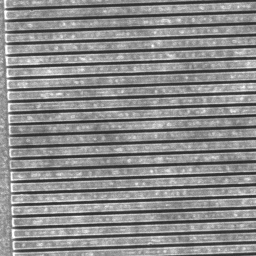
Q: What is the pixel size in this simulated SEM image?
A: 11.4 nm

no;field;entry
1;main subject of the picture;parallel lines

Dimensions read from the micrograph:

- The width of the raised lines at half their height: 0.088 µm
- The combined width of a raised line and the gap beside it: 131 nanometres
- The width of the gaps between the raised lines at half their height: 0.0341 microns